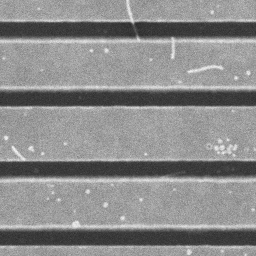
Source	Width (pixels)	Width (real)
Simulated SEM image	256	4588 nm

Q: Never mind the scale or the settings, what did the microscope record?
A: lines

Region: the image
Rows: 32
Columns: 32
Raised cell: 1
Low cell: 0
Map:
11111111111111111111111111111111
11111111111111111111111111111111
11111111111111111111111111111111
00000000000000000000000000000000
00000000000000000000000000000000
11111111111111111111111111111111
11111111111111111111111111111111
11111111111111111111111111111111
11111111111111111111111111111111
11111111111111111111111111111111
11111111111111111111111111111111
00000000000000000000000000000000
00000000000000000000000000000000
11111111111111111111111111111111
11111111111111111111111111111111
11111111111111111111111111111111
11111111111111111111111111111111
11111111111111111111111111111111
11111111111111111111111111111111
11111111111111111111111111111111
00000000000000000000000000000000
00000000000000000000000000000000
11111111111111111111111111111111
11111111111111111111111111111111
11111111111111111111111111111111
11111111111111111111111111111111
11111111111111111111111111111111
11111111111111111111111111111111
11111111111111111111111111111111
00000000000000000000000000000000
00000000000000000000000000000000
11111111111111111111111111111111